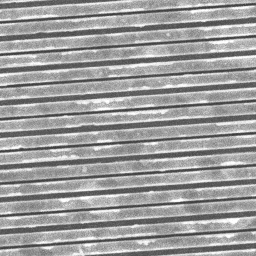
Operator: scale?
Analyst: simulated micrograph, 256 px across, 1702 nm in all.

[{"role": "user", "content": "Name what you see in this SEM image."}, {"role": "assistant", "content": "parallel lines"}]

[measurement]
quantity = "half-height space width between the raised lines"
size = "25.7 nanometers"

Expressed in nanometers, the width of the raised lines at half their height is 69.6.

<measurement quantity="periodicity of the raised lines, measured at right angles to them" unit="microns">0.107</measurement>